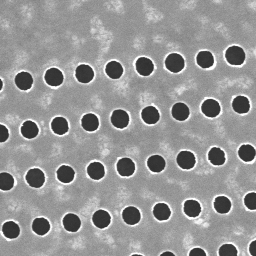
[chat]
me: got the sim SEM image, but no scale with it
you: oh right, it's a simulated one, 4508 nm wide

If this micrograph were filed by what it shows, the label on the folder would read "a regular array of holes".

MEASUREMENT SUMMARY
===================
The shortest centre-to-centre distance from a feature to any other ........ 30.4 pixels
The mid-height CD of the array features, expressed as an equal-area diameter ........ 329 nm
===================